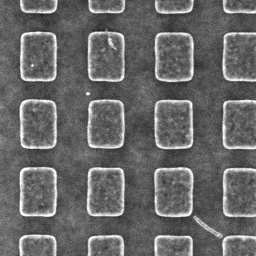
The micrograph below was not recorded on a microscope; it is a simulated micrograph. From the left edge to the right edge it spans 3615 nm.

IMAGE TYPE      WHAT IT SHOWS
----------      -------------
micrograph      wiring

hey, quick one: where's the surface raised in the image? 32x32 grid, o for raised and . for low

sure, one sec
...oooo....ooooo....oooo....oooo
...oooo.....ooo.....ooo.....oooo
................................
................................
...oooo....oooo.....oooo....oooo
...oooo....ooooo...ooooo....oooo
...oooo....ooooo...ooooo....oooo
...oooo....ooooo....oooo....oooo
...oooo....ooooo....oooo....oooo
...oooo....oooo.....oooo....oooo
................................
................................
................................
...oooo....oooo....ooooo....oooo
...oooo....oooo....ooooo....oooo
...oooo....ooooo...ooooo....oooo
...oooo....ooooo...ooooo....oooo
...oooo....oooo.....oooo....oooo
.....o..............ooo......ooo
................................
................................
...oooo....oooo....ooooo....oooo
...oooo....ooooo...ooooo....oooo
...oooo....ooooo...ooooo....oooo
...oooo....oooo....ooooo....oooo
...oooo....oooo....ooooo....oooo
...oooo....oooo.....oooo....oooo
................................
................................
...ooo.......oo.................
..ooooo....oooo....ooooo....oooo
..ooooo....oooo....ooooo....oooo